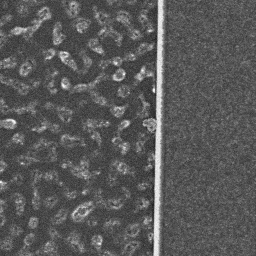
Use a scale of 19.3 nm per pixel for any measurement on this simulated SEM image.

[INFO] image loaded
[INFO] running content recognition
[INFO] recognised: one or a few lines or trenches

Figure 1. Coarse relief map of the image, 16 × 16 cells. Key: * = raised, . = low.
..........******
..........******
..........******
..........******
..........******
..........******
..........******
..........******
..........******
..........******
..........******
..........******
..........******
..........******
..........******
..........******